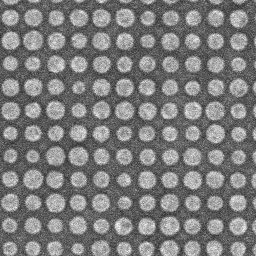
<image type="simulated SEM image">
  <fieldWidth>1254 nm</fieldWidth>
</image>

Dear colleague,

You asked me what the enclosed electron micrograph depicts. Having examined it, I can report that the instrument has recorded a regular array of raised bodies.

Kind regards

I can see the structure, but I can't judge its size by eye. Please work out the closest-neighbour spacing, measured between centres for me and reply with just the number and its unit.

110 nm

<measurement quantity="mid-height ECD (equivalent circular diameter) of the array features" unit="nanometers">74.1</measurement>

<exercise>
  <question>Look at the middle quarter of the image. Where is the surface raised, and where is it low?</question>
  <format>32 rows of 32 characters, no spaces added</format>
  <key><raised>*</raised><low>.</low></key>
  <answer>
..***...***..****..****..***...*
...**...***...**....**...***...*
................................
................................
........***...***..***...***....
..***...***..****..****..***...*
..***...***..****..****..***...*
........***...**....*...........
................................
................................
..***...***..****..***...***...*
..***..****..****..****.****..**
..***...***..****..****.****..**
..............**....*..........*
................................
................................
..***...***...**...***...***...*
..***...***...***..***...***..**
..***...***...***..***...***...*
................................
................................
..***....*.....*...............*
.*****..***..****..****..***..**
.*****..***..****..****..***..**
..****..***...**....**...***..**
................................
................................
..***...**.........***....*....*
..***..****...***..****..***..**
..***..****...**...****..***..**
...**...**.........***...**....*
................................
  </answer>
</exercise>